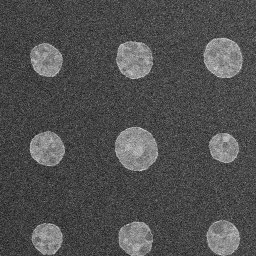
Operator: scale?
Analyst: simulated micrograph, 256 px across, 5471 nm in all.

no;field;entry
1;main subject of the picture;raised bodies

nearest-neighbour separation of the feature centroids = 1880 nm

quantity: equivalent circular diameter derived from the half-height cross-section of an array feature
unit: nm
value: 727